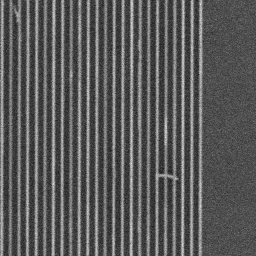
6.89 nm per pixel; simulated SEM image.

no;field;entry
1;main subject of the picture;parallel lines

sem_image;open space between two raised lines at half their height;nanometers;47.4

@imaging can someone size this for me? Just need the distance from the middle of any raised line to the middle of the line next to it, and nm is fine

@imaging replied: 59.4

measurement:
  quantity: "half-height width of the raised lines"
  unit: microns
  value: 0.0138